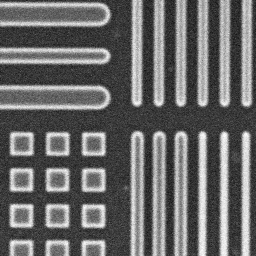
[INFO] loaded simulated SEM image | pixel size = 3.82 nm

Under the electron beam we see groups of lines, slits or small figures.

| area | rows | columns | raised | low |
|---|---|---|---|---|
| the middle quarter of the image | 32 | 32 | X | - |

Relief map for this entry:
-----------------XX----XX---XX--
-----------------XX----XX---XX--
-----------------XX----XX---XX--
-----------------XX----XX---XX--
-----------------XX----XX---XX--
-----------------XX----XX---XX--
XXXXXXXXXX-------XX----XX---XX--
XXXXXXXXXXX------XX----XX---XX--
XXXXXXXXXXX------XX----XX---XX--
XXXXXXXXXXX------XX----X----XX--
XXXXXXXXXX----------------------
--------------------------------
--------------------------------
--------------------------------
--------------------------------
--------------------------------
--------------------------------
X-----------------X----XX---XX--
X----XXXXX-------XXX---XX---XX--
X----XXXXX-------XXX---XX---XX--
X----XXXXX-------XXX---XX---XX--
X----XXXXX-------XXX---XX---XX--
-----------------XX----XX---XX--
-----------------XX----XX---XX--
-----------------XX----XX---XX--
-----------------XX----XX---XX--
-----------------XX----XX---XX--
X----XXXXX-------XX----XX---XX--
X----XXXXX-------XX----XX---XX--
X----XXXXX-------XX----XX---XX--
X----XXXXX-------XX----XX---XX--
X----XXXXX-------XX----XX---XX--